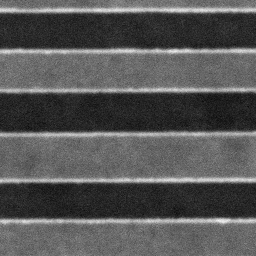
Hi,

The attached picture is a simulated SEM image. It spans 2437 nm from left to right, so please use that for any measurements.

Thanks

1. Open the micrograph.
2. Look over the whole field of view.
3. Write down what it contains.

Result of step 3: lines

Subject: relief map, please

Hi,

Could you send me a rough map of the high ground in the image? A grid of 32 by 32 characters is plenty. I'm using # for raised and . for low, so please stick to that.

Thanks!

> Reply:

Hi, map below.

################################
................................
................................
................................
................................
................................
################################
################################
################################
################################
################################
................................
................................
................................
................................
................................
................................
################################
################################
################################
################################
################################
##########################.#...#
................................
................................
................................
................................
......................#....##...
################################
################################
################################
################################